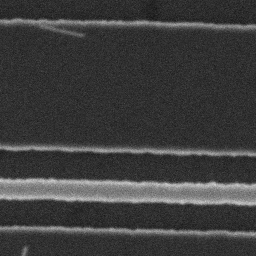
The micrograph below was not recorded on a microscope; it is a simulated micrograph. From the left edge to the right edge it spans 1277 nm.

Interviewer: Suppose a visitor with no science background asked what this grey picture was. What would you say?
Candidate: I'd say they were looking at lines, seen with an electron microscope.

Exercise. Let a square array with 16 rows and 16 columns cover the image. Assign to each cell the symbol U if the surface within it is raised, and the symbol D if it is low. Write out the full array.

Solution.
DDDDDDDDDDDDDDDD
UUUUUUUUUUUUUDDD
UUUUUUUUUUUUUUUU
UUUUUUUUUUUUUUUU
UUUUUUUUUUUUUUUU
UUUUUUUUUUUUUUUU
UUUUUUUUUUUUUUUU
UUUUUUUUUUUUUUUU
UUUUUUUUUUUUUUUU
DDDDDDDDUUUUUUUU
DDDDDDDDDDDDDDDD
DDDDDDDDDDDDDDDD
DDDDDDDDDDDDDDDD
DDDDDDDDDDDDDDDD
UUUUUUUUUUUUUUDD
UUUUUUUUUUUUUUUU